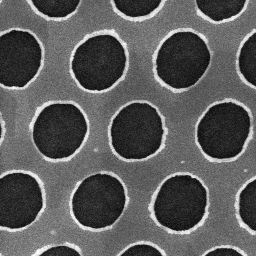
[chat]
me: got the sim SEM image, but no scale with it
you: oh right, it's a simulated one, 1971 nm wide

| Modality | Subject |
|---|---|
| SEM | holes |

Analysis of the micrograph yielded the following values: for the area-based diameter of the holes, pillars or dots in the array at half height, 424 nm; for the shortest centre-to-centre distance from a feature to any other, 614 nm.